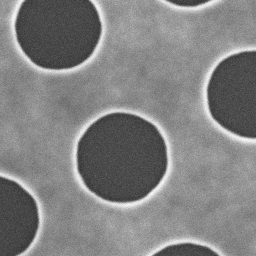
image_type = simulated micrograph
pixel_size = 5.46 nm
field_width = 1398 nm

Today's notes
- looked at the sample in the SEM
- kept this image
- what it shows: holes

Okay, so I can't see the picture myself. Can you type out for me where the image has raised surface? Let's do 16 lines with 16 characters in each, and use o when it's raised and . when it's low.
o.....oooooooooo
o.....oooooooooo
o.....oooooooooo
oo....oooooooo..
ooooooooooooo...
ooooooooooooo...
ooooooooooooo...
oooooo...oooo...
ooooo.....ooooo.
ooooo.....oooooo
ooooo.....oooooo
.oooo.....oooooo
..ooooo..ooooooo
..oooooooooooooo
..oooooooooooooo
..oooooooo...ooo